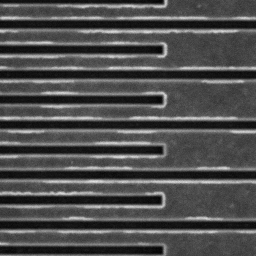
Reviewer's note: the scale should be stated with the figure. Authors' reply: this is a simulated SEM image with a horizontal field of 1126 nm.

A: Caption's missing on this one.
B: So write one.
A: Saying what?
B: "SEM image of parallel lines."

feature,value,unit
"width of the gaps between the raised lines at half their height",44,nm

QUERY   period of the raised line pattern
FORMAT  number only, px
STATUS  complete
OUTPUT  25.1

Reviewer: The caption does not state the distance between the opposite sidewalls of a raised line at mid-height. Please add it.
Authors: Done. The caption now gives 66 nanometers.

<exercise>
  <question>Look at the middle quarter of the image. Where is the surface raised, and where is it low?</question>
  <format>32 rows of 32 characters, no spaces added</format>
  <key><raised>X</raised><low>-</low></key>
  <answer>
XXXXXXXXXXXXXXXXXXXXXXXXXXXXXXXX
--------------------------------
--------------------------------
--------------------------------
XXXXXXXXXXXXXXXXXXXXXXXXXXXXXXXX
XXXXXXXXXXXXXXXXXXXXXXXXXXXXXXXX
XXXXXXXXXXXXXXXXXXXXXXXXXXXXXXXX
XXXXXXXXXXXXXXXXXXXXXXXXXXXXXXXX
-------------------------XXXXXXX
-------------------------XXXXXXX
XXXXXXXXXXXXXXXXXXXXXXXXXXXXXXXX
XXXXXXXXXXXXXXXXXXXXXXXXXXXXXXXX
XXXXXXXXXXXXXXXXXXXXXXXXXXXXXXXX
XXXXXXXXXXXXXXXXXXXXXXXXXXXXXXXX
--------------------------------
--------------------------------
--------------------------------
XXXXXXXXXXXXXXXXXXXXXXXXXXXXXXXX
XXXXXXXXXXXXXXXXXXXXXXXXXXXXXXXX
XXXXXXXXXXXXXXXXXXXXXXXXXXXXXXXX
-------------------------XXXXXXX
-------------------------XXXXXXX
-------------------------XXXXXXX
XXXXXXXXXXXXXXXXXXXXXXXXXXXXXXXX
XXXXXXXXXXXXXXXXXXXXXXXXXXXXXXXX
XXXXXXXXXXXXXXXXXXXXXXXXXXXXXXXX
--------------------------------
--------------------------------
--------------------------------
XXXXXXXXXXXXXXXXXXXXXXXXXXXXXXXX
XXXXXXXXXXXXXXXXXXXXXXXXXXXXXXXX
XXXXXXXXXXXXXXXXXXXXXXXXXXXXXXXX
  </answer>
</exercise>